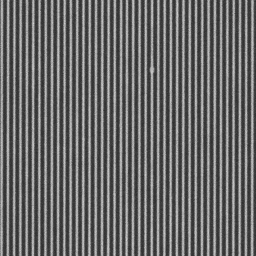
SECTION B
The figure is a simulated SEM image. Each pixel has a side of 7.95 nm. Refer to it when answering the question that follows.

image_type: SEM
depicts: parallel lines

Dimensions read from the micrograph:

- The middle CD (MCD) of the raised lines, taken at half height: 0.0149 microns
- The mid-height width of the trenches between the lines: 29.8 nanometers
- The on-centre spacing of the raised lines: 49.8 nm